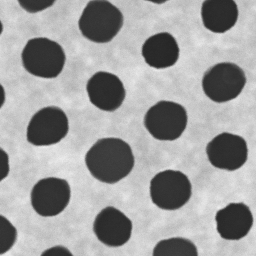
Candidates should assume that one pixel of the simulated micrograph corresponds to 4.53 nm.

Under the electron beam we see a regular array of holes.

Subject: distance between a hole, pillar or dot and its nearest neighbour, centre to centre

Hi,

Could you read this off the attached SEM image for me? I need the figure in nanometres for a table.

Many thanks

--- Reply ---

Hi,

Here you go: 309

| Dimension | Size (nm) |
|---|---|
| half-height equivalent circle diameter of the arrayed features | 180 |